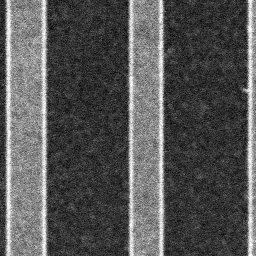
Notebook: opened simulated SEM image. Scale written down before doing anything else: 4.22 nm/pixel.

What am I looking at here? one or a few lines or trenches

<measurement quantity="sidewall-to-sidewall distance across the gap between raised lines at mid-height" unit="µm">0.369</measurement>